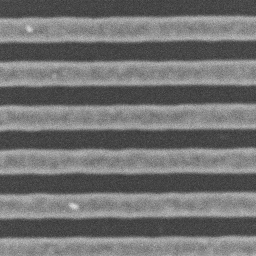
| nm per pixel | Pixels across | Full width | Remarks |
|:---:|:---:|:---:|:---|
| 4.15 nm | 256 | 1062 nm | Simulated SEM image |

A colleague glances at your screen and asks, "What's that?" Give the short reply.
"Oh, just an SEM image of wiring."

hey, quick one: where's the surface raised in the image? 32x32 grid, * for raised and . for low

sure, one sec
................................
................................
********************************
********************************
********************************
................................
................................
................................
********************************
********************************
*********************........***
................................
................................
********************************
********************************
********************************
................................
................................
................................
********************************
********************************
*********.************...*******
................................
................................
********************************
********************************
********************************
................................
................................
................................
********************************
********************************